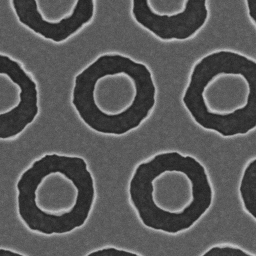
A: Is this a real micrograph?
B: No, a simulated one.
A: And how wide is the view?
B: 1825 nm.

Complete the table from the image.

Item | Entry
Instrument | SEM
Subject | ring-shaped grooves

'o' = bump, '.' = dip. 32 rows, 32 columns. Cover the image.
oo...ooooo..ooooo..oooo...ooooo.
oo...oooo...ooooo..oooo...ooooo.
ooo...oo...oooooo.........oooooo
oooo......oooooooo.......ooooooo
ooooo....ooooooooooo....oooooooo
oooooooooooooooooooooooooooooooo
ooooooooooooooooooooooooooo..ooo
..oooooooooo....ooooooooo......o
...oooooooo.......oooooo........
o...oooooo...ooo...ooooo...ooo..
oo..ooooo...ooooo..ooooo..ooooo.
ooo..oooo...ooooo..oooo..oooooo.
oo...oooo...ooooo..oooo..oooooo.
oo...ooooo..oooo...oooo...oooo..
....oooooo........oooooo........
...oooooooo......oooooooo.......
...oooooooooo...ooooooooooo....o
oooooooooooooooooooooooooooooooo
oooooooooooooooooooooooooooooooo
oooooo..oooooooooooo...ooooooooo
oooo.......ooooooo.......oooooo.
ooo........oooooo...ooo...ooooo.
ooo..oooo...oooo...ooooo..oooo..
oo...ooooo..oooo...ooooo..oooo..
oo..oooooo..oooo...ooooo..oooo..
oo...oooo..oooooo..ooooo..ooooo.
oo....oo...oooooo....o....ooooo.
ooo........ooooooo.......ooooooo
oooo.....oooooooooo....ooooooooo
oooooooooooooooooooooooooooooooo
oooooooooooooooooooooooooooooooo
..oooooooooo....oooooooooo.....o